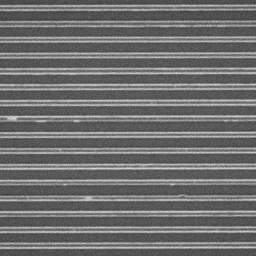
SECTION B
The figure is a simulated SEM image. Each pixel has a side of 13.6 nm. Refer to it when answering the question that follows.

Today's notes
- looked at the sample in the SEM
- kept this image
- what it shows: parallel lines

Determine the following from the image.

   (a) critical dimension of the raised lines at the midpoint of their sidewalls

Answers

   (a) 61 nanometres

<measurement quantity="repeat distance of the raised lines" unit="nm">215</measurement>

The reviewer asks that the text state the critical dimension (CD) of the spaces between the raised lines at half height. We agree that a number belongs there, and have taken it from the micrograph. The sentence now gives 156 nm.